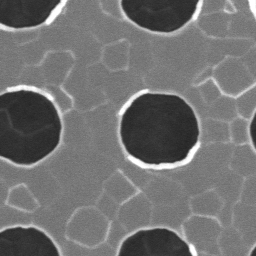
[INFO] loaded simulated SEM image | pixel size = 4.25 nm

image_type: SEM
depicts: holes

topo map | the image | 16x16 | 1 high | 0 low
0001111100001111
0011111110001111
1111111111111111
1111111111111111
1111111111111111
1111111111111111
0001111100001111
0000111100001111
0000111100001111
0001111100001111
1111111111111111
1111111111111111
1111111111111111
1111111111111111
0001111110011111
0001111100001111